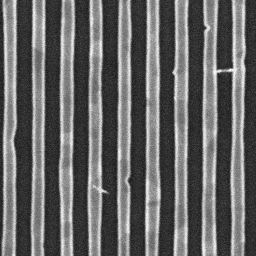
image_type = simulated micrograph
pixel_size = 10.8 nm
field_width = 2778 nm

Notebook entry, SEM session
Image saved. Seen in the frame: parallel lines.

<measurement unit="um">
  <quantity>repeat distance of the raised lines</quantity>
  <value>0.31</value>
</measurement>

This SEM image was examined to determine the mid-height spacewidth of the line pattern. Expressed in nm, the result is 197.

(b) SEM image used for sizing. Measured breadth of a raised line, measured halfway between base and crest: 108 nm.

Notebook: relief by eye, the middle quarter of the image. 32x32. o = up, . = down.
oo.....oo.....oo.....oo.....ooo.
oo.....oo.....oo.....oo.....ooo.
oo.....oo.....oo.....oo.....ooo.
oo.....oo.....oo.....oo.....ooo.
oo.....oo.....oo.....oo.....ooo.
oo.....oo.....oo.....oo.....ooo.
oo.....oo.....oo.....oo.....ooo.
oo.....oo.....oo.....oo.....ooo.
oo.....oo.....oo.....oo.....ooo.
oo.....oo.....oo.....oo.....ooo.
oo.....oo.....oo.....oo.....ooo.
oo.....oo.....oo.....oo.....ooo.
oo.....oo.....oo.....oo.....ooo.
oo.....oo.....oo.....oo.....ooo.
oo.....oo.....oo.....oo.....ooo.
oo.....oo.....oo.....oo.....ooo.
oo.....oo.....oo.....oo.....ooo.
oo.....oo.....oo.....oo.....ooo.
oo.....oo.....oo.....oo.....ooo.
oo.....oo.....oo.....oo.....ooo.
oo.....oo.....oo.....oo.....ooo.
oo.....oo.....oo.....oo.....ooo.
oo.....oo.....oo.....oo.....oo..
oo.....oo.....oo.....oo.....oo..
oo.....oo.....oo.....oo.....oo..
oo.....oo.....oo.....oo.....oo..
oo.....oo.....oo.....oo.....oo..
oo.....oo.....oo.....oo.....oo..
oo.....oo.....oo.....oo.....oo..
oo....ooo.....oo.....oo.....oo..
oo....ooo.....oo.....oo.....oo..
oo....oooo....oo.....ooo....oo..